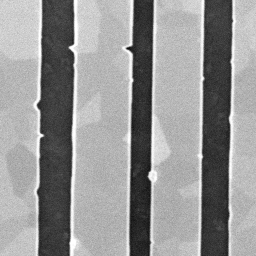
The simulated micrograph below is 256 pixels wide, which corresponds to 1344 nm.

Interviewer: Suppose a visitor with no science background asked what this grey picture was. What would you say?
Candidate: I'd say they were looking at one or a few lines or trenches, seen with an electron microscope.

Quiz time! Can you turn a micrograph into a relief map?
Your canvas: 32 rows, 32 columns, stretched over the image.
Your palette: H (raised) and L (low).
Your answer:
HHHHHLLLLHHHHHHHLLLHHHHHHLLLLHHH
HHHHHLLLLHHHHHHHLLLHHHHHHLLLLHHH
HHHHHLLLLHHHHHHHLLLHHHHHHLLLLHHH
HHHHHLLLLHHHHHHHLLLHHHHHHLLLLHHH
HHHHHLLLLHHHHHHHLLLHHHHHHLLLLHHH
HHHHHLLLLHHHHHHHLLLHHHHHHLLLLHHH
HHHHHLLLLHHHHHHHLLLHHHHHHLLLLHHH
HHHHHLLLLLHHHHHHLLLHHHHHHLLLLHHH
HHHHHLLLLHHHHHHHLLLHHHHHHLLLLHHH
HHHHHLLLLHHHHHHHLLLHHHHHHLLLLHHH
HHHHHLLLLHHHHHHHLLLHHHHHHLLLLHHH
HHHHHLLLLHHHHHHHLLLHHHHHHLLLLHHH
HHHHHLLLLHHHHHHHLLLHHHHHHLLLLHHH
HHHHHLLLLHHHHHHHLLLHHHHHHLLLLHHH
HHHHHLLLLHHHHHHHLLLHHHHHHLLLLHHH
HHHHHLLLLHHHHHHHLLLHHHHHHLLLLHHH
HHHHHLLLLHHHHHHHLLLHHHHHHLLLLHHH
HHHHHLLLLHHHHHHHLLLHHHHHHLLLLHHH
HHHHHLLLLHHHHHHHLLLHHHHHHLLLLHHH
HHHHHLLLLHHHHHHHLLLHHHHHHLLLLHHH
HHHHHLLLLHHHHHHHLLLHHHHHHLLLLHHH
HHHHHLLLLHHHHHHHLLLHHHHHHLLLLHHH
HHHHHLLLLHHHHHHHLLLHHHHHHLLLLHHH
HHHHHLLLLHHHHHHHLLLHHHHHHLLLLHHH
HHHHHLLLLHHHHHHHLLLHHHHHHLLLLHHH
HHHHHLLLLHHHHHHHLLLHHHHHHLLLLHHH
HHHHHLLLLHHHHHHHLLLHHHHHHLLLLHHH
HHHHHLLLLHHHHHHHLLLHHHHHHLLLLHHH
HHHHHLLLLHHHHHHHLLLHHHHHHLLLLHHH
HHHHHLLLLHHHHHHHLLLHHHHHHLLLLHHH
HHHHHLLLLHHHHHHHLLLHHHHHHLLLLHHH
HHHHHLLLLHHHHHHHLLLHHHHHHLLLLHHH